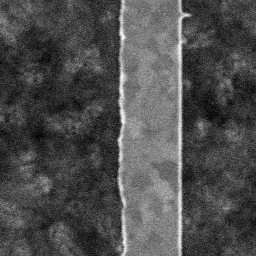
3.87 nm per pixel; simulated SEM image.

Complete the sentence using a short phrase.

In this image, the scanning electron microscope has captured one or a few lines or trenches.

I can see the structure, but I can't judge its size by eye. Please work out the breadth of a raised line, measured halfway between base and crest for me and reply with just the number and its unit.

229 nanometers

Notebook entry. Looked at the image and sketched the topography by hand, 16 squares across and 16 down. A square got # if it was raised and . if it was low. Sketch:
........###.....
........###.....
........###.....
........###.....
........###.....
........###.....
........###.....
........###.....
........###.....
........###.....
.......####.....
.......####.....
........###.....
........###.....
........###.....
........###.....